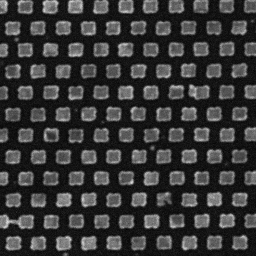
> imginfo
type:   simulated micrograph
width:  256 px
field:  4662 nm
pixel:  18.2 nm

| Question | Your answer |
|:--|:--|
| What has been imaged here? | a regular array of raised bodies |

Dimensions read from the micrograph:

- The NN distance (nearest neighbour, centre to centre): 447 nm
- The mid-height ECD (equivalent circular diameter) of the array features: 0.26 microns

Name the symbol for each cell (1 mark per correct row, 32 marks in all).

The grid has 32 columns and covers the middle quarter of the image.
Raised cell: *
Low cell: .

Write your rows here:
*....***...***...***....**....**
*....***...***...***...****...**
*....***...***...***...****..***
................................
................................
................................
.****...***...***...***....***..
.****...***...***...***....***..
..**....**....***...***....**...
................................
................................
*....***...***...***....***...**
*....***...***...***...****...**
*....***...***...***...****...**
................................
................................
........***...***....**....***..
.****...***...***...***....***..
.****...***...***...***...****..
................................
................................
................................
*....***...***...***...****...**
*....***...***...***...****...**
*....***...***...***....**....**
................................
................................
.****...***...***...***....***..
..***...***...***...***....***..
.****...***...***...***....***..
................................
................................